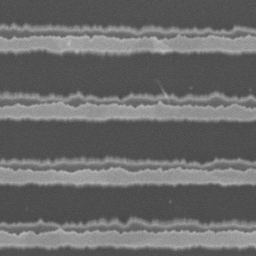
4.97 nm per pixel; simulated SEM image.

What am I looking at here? lines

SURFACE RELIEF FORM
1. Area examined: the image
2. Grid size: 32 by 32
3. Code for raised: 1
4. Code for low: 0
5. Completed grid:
00000000000000000000000000000000
00000000000000000000000000000000
00000000000000000000000000000000
11000000000000000000000000000000
11111111111111111111111111111111
11111111111111111111111111111111
00000000000000000000000000000000
00000000000000000000000000000000
00000000000000000000000000000000
00000000000000000000000000000000
00000000000000000000000000000000
00000000000000000000000000000000
11111111111111111111111111111111
11111111111111111111111111111111
11111111111111111111111111111111
00000000000000000000000000000000
00000000000000000000000000000000
00000000000000000000000000000000
00000000000000000000000000000000
00000000000000000000000000000000
11111111111111111111111110111111
11111111111111111111111111111111
11111111111111111111111111111111
00000000000000000000000000000000
00000000000000000000000000000000
00000000000000000000000000000000
00000000000000000000000000000000
00000000000000000000000000000000
11111111111111111111111111111111
11111111111111111111111111111111
11111111111111111111111111111111
00000000000000000000000000000000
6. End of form